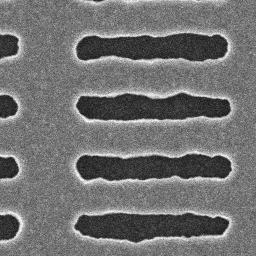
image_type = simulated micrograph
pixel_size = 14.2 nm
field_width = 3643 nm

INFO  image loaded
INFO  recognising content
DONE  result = holes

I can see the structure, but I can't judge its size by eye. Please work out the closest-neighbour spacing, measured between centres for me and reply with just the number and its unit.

59.5 px